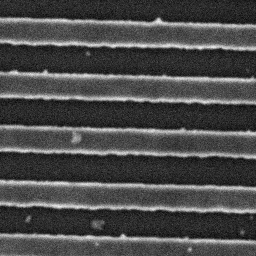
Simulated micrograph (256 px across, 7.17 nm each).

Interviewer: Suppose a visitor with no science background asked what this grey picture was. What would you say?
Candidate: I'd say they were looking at lines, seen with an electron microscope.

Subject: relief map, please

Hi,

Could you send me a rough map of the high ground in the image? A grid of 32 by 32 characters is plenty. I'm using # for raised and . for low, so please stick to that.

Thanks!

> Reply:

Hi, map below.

................................
................................
#########.......................
################################
################################
..##############################
................................
................................
................................
##################..............
################################
################################
................################
................................
................................
................................
###########################.....
################################
################################
......................####.#####
................................
................................
................................
################################
################################
################################
.............................###
................................
................................
#######.........................
################################
################################